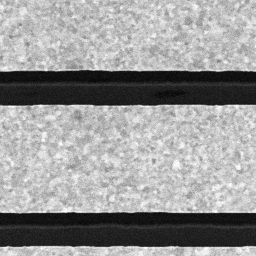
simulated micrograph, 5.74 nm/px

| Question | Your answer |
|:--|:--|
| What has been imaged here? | lines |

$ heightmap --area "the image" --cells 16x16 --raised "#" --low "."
################
################
################
################
................
................
................
################
################
################
################
################
################
................
................
################